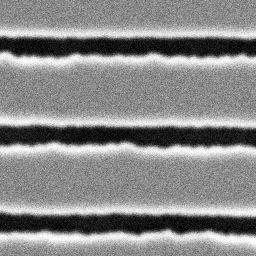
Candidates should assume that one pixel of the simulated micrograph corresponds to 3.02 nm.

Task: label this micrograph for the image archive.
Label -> lines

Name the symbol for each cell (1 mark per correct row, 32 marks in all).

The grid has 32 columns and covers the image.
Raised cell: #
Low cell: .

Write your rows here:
################################
################################
################################
################################
################################
................................
................................
################################
################################
################################
################################
################################
################################
################################
################################
####.###########################
................................
................................
####################.###########
################################
################################
################################
################################
################################
################################
################################
.###############################
................................
................................
#############################...
################################
################################